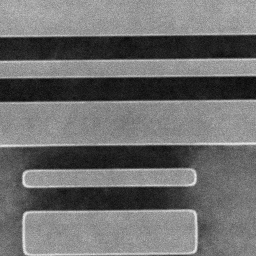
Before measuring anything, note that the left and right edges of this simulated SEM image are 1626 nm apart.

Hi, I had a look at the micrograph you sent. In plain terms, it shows groups of lines, slits or small figures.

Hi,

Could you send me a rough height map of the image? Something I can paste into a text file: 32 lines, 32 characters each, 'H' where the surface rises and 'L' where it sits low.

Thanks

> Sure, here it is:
HHHHHHHHHHHHHHHHHHHHHHHHHHHHHHHH
HHHHHHHHHHHHHHHHHHHHHHHHHHHHHHHH
HHHHHHHHHHHHHHHHHHHHHHHHHHHHHHHH
HHHHHHHHHHHHHHHHHHHHHHHHHHHHHHHH
HHHHHHHHHHHHHHHLLLLLLLLLLLLLLLLL
LLLLLLLLLLLLLLLLLLLLLLLLLLLLLLLL
LLLLLLLLLLLLLLLLLLLLLLLLLLLLLLLL
LLLLLLLLLLLLLLLLLHHHHHHHHHHHHHHH
HHHHHHHHHHHHHHHHHHHHHHHHHHHHHHHH
HHHHHHHHHHHHHHHHHHHHHHHHHHHHHHLL
LLLLLLLLLLLLLLLLLLLLLLLLLLLLLLLL
LLLLLLLLLLLLLLLLLLLLLLLLLLLLLLLL
LLLLLLLLLLLLLLLLLLLLLLLLLLLLLLLL
HHHHHHHHHHHHHHHHHHHHHHHHHHHHHHHH
HHHHHHHHHHHHHHHHHHHHHHHHHHHHHHHH
HHHHHHHHHHHHHHHHHHHHHHHHHHHHHHHH
HHHHHHHHHHHHHHHHHHHHHHHHHHHHHHHH
HHHHHHHHHHHHHHHHHHHHHHHHHHHHHHHH
LLLLLLLLLLLLLLLLLLLLLLLLLLLLLLLL
LLLLLLLLLLLLLLLLLLLLLLLLLLLLLLLL
LLLLLLLLLLLLLLLLLLLLLLLLLLLLLLLL
LLLHHHHHHHHHHHHHHHHHHHHHLLLLLLLL
LLLHHHHHHHHHHHHHHHHHHHHHLLLLLLLL
LLLLLLLLLLLLLLLLLLLLLLLLLLLLLLLL
LLLLLLLLLLLLLLLLLLLLLLLLLLLLLLLL
LLLLLLLLLLLLLLLLLLLLLLLLLLLLLLLL
LLLHHHHHHHHHHHHHHHHHHHHHLLLLLLLL
LLLHHHHHHHHHHHHHHHHHHHHHLLLLLLLL
LLLHHHHHHHHHHHHHHHHHHHHHLLLLLLLL
LLLHHHHHHHHHHHHHHHHHHHHHLLLLLLLL
LLLHHHHHHHHHHHHHHHHHHHHHLLLLLLLL
LLLHHHHHHHHHHHHHHHHHHHHHLLLLLLLL